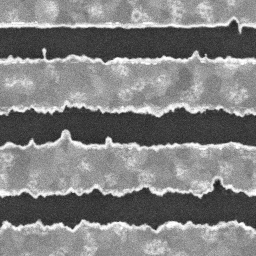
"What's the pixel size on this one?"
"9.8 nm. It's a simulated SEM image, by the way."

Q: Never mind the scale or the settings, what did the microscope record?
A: one or a few lines or trenches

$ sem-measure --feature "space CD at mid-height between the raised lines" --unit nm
331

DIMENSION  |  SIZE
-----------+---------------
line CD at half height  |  480 nanometres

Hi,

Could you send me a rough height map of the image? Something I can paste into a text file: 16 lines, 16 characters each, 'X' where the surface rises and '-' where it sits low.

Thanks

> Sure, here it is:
XXXXXXXXXXXXXXXX
XXXXXXXXXXXXXX-X
----------------
------------X---
XXXXXXXXXXXXXXXX
XXXXXXXXXXXXXXXX
XXXXXXXXXXXXXXXX
----------------
----------------
XXXXXXXXXXXXXXXX
XXXXXXXXXXXXXXXX
XXXXXXXXXXXXX-XX
----------------
----------------
XXXXXXXXXXXXXXXX
XXXXXXXXXXXXXXXX